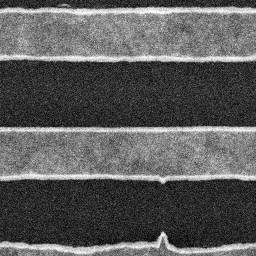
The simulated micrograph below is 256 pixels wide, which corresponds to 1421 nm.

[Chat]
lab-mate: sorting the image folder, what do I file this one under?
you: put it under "one or a few lines or trenches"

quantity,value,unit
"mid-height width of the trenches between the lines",386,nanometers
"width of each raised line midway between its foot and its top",268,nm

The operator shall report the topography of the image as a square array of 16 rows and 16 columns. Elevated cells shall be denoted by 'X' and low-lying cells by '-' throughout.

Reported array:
----------------
XXXXXXXXXXXXXXXX
XXXXXXXXXXXXXXXX
XXXXXXXXXXXXXXXX
----------------
----------------
----------------
----------------
XXXXXXXXXXXXXXXX
XXXXXXXXXXXXXXXX
XXXXXXXXXXXXXXXX
----------------
----------------
----------------
----------------
XXXX--XXXXX---XX